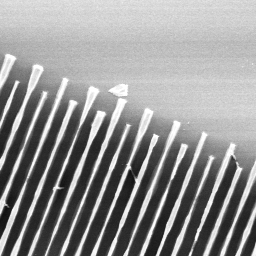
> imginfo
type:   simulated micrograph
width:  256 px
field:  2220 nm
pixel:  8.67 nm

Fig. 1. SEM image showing parallel lines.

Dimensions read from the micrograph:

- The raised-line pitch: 129 nanometers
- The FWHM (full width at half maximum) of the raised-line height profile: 0.0384 microns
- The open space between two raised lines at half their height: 92.9 nanometres